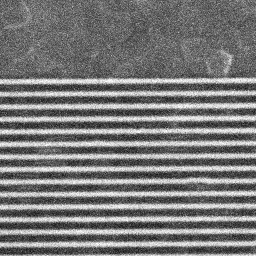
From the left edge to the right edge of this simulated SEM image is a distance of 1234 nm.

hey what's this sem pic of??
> parallel lines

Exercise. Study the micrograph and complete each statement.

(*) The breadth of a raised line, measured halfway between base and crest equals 16.9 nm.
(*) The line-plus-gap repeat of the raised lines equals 60.4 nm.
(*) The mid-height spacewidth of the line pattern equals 42.1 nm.